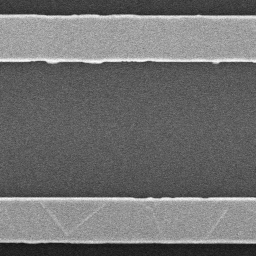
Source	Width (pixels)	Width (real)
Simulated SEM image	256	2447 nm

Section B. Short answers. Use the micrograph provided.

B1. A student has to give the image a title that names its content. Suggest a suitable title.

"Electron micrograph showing lines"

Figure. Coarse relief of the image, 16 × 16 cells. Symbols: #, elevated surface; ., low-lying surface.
................
################
################
################
................
................
................
................
................
................
................
................
################
################
################
................